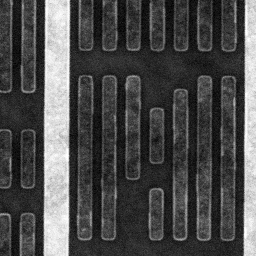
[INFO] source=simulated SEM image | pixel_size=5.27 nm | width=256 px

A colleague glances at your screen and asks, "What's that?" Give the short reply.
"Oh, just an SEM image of groups of lines, slits or small figures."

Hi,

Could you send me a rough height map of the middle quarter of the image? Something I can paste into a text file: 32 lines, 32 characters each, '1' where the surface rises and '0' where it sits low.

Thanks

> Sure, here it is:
10000000000000000000000000000000
10000000000000000000000000000000
10000000000000000000000000000000
10001110001110001110000000000000
10001110001110001110000000000000
10001110001110001110000000000000
10001110001110001110000000001100
10001110001110001110000000001110
10001110001110001110000000001110
10001110001110001110000000001110
10001110001110001110000000001110
10001110001110001110001100001110
10001110001110001110001110001110
10001110001110001110001110001110
10001110001110001110001110001110
10001110001110001110001110001110
10001110001110001110001110001110
10001110001110001110001110001110
10001110001110001110001110001110
10001110001110001110001110001110
10001110001110001110001110001110
10001110001110001110001110001110
10001110001110001110001110001110
10001110001110001110001110001110
10001110001110001110001100001110
10001110001110001110000000001110
10001110001110001110000000001110
10001110001110001110000000001110
10001110001110001100000000001110
10001110001110000000000000001110
10001110001110000000000000001110
10001110001110000000001100001110